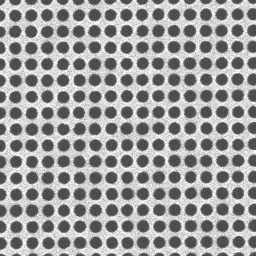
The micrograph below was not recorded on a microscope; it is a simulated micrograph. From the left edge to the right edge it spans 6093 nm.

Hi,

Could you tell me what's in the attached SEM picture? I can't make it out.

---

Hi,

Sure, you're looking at a regular array of holes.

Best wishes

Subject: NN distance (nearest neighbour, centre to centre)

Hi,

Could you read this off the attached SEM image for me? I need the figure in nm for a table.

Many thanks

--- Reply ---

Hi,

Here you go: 373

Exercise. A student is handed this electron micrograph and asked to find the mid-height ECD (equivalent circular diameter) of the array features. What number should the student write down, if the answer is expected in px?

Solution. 12.9